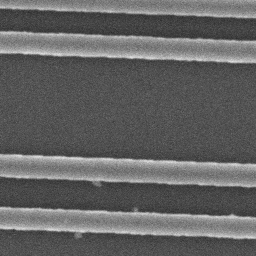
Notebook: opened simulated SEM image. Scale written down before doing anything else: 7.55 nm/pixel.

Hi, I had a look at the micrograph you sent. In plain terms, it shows lines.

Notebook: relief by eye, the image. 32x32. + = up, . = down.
++++++++++++++++++++++++++++++++
............++++++++++++++++++++
................................
................................
+++++++++++++...................
++++++++++++++++++++++++++++++++
++++++++++++++++++++++++++++++++
.......................+++++++++
................................
................................
................................
................................
................................
................................
................................
................................
................................
................................
................................
+++.............................
++++++++++++++++++++++++++++++..
++++++++++++++++++++++++++++++++
...........+++++++++++++++++++++
................................
................................
................................
+++++++++++++...................
++++++++++++++++++++++++++++++++
++++++++++++++++++++++++++++++++
..........................++++++
................................
................................